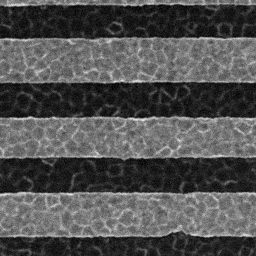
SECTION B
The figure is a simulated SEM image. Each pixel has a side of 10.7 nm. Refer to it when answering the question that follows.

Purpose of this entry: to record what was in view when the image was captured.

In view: one or a few lines or trenches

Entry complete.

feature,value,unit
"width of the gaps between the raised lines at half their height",380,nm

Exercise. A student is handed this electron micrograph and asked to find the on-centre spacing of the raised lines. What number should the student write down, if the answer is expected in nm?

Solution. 825